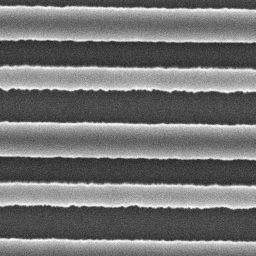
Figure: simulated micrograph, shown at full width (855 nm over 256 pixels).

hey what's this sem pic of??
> lines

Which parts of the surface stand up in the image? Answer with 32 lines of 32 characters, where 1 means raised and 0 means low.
00000000000000000000000000000000
11111111111111111111111111111111
11111111111111111111111111111111
11111111111111111111111111111111
11111111111111111111111111111111
00000000000000000000000000000000
00000000000000000000000000000000
00000000000000000000000000000000
11111111101100000000000000000000
11111111111111111111111111111111
11111111111111111111111111111111
00000000000000000000000000001000
00000000000000000000000000000000
00000000000000000000000000000000
00000000000000000000000000000000
11111111111111110000000000000000
11111111111111111111111111111111
11111111111111111111111111111111
11111111111111111111111111111111
00011111111111111111111111111111
00000000000000000000000000000000
00000000000000000000000000000000
00000000000000000000000000000000
11111111111111111111111111111111
11111111111111111111111111111111
11111111111111111111111111111111
00000000000000000000000000000000
00000000000000000000000000000000
00000000000000000000000000000000
00000000000000000000000000000000
11111111111111111111111111111111
11111111111111111111111111111111